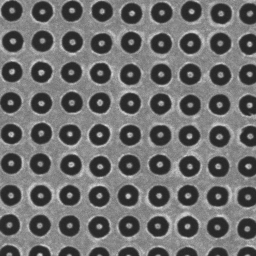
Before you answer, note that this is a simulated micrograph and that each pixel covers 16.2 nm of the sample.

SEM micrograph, a regular array of ring-shaped grooves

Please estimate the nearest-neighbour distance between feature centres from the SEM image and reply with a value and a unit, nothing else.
474 nm